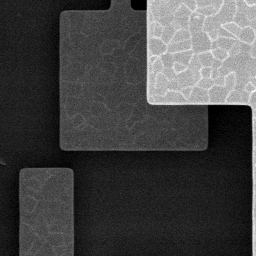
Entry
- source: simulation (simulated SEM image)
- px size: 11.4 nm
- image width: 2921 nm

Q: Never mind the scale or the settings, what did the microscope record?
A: wiring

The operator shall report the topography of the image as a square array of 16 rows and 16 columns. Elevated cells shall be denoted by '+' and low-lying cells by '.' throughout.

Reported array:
.........+++++++
.........+++++++
.........+++++++
.........+++++++
.........+++++++
.........+++++++
..........++++++
................
................
................
................
................
................
................
................
................